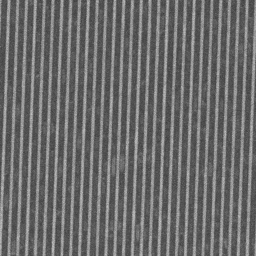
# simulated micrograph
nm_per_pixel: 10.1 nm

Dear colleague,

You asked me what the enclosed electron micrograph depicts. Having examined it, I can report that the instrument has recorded parallel lines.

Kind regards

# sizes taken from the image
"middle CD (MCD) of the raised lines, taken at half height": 17.7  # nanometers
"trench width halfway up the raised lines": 68.2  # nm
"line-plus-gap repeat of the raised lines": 0.0893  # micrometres